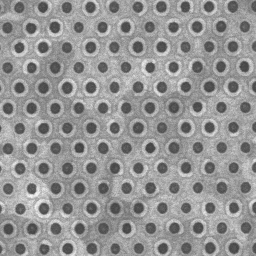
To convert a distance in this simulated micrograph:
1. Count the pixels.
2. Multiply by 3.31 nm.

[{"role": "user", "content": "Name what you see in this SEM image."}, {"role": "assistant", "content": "a regular array of holes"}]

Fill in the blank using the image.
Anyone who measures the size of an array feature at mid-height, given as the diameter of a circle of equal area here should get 38.3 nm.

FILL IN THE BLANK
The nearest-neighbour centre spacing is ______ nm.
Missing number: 76.2